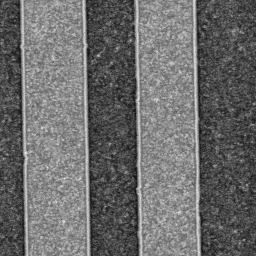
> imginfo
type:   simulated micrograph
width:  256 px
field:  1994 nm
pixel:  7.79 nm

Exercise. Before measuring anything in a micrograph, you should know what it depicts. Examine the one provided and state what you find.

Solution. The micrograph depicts one or a few lines or trenches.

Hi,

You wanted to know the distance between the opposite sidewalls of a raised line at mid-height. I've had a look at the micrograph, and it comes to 465 nanometers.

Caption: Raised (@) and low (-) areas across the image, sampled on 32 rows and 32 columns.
---@@@@@@@-------@@@@@@@--------
---@@@@@@@-------@@@@@@@--------
---@@@@@@@@------@@@@@@@--------
---@@@@@@@@------@@@@@@@--------
---@@@@@@@@------@@@@@@@--------
---@@@@@@@@------@@@@@@@--------
---@@@@@@@-------@@@@@@@--------
---@@@@@@@@------@@@@@@@--------
---@@@@@@@@------@@@@@@@--------
---@@@@@@@@------@@@@@@@--------
---@@@@@@@@------@@@@@@@--------
---@@@@@@@@------@@@@@@@--------
---@@@@@@@@------@@@@@@@--------
---@@@@@@@@------@@@@@@@--------
---@@@@@@@@------@@@@@@@@-------
---@@@@@@@@------@@@@@@@--------
---@@@@@@@@------@@@@@@@--------
---@@@@@@@@------@@@@@@@@-------
---@@@@@@@@------@@@@@@@@-------
---@@@@@@@@------@@@@@@@@-------
---@@@@@@@@------@@@@@@@@-------
---@@@@@@@@-------@@@@@@@-------
---@@@@@@@@-------@@@@@@@-------
---@@@@@@@@------@@@@@@@@-------
---@@@@@@@@------@@@@@@@@-------
---@@@@@@@@-------@@@@@@@-------
---@@@@@@@@-------@@@@@@@-------
---@@@@@@@@-------@@@@@@@-------
---@@@@@@@@-------@@@@@@@-------
---@@@@@@@@-------@@@@@@@-------
---@@@@@@@@-------@@@@@@@-------
---@@@@@@@@-------@@@@@@@-------